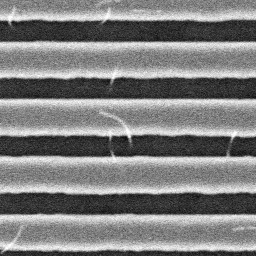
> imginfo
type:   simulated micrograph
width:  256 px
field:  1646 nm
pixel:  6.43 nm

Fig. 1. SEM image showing lines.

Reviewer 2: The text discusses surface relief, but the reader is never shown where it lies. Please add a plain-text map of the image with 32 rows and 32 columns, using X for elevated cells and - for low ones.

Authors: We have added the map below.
XXXXXXXXXXXXXXXXXXXXXXXXXXXXXXXX
XXXXXXXXXXXXXXXXXXXXXXXXXXXXXXXX
XXXX-XXXXXXX----XXXX----XXXX----
--------------------------------
--------------------------------
XXXXXXXXXXXXXXXXXXXXXXXXXXXXXXXX
XXXXXXXXXXXXXXXXXXXXXXXXXXXXXXXX
XXXXXXXXXXXXXXXXXXXXXXXXXXXXXXXX
XXXXXXXXXXXXXXXXXXXXXXXXXXXXXXXX
XXXXXXXXXXXXXXXXXXXXXXXXXXXXXXXX
--------------------------------
--------------------------------
---XX------------------X--------
XXXXXXXXXXXXXXXXXXXXXXXXXXXXXXXX
XXXXXXXXXXXXXXXXXXXXXXXXXXXXXXXX
XXXXXXXXXXXXXXXXXXXXXXXXXXXXXXXX
XXXXXXXXXXXXXXXXXXXXXXXXXXXXXXXX
--------------------------------
--------------------------------
--------------------------------
XXXXXXXXXXXXXXXXXXXXXXXXXXXXXXXX
XXXXXXXXXXXXXXXXXXXXXXXXXXXXXXXX
XXXXXXXXXXXXXXXXXXXXXXXXXXXXXXXX
XXXXXXXXXXXXXXXXXXXXXXXXXXXXXXXX
--------------------------------
--------------------------------
--------------------------------
XXXXXXXXXXXXXXXXXXXXXXXXXXXXXXXX
XXXXXXXXXXXXXXXXXXXXXXXXXXXXXXXX
XXXXXXXXXXXXXXXXXXXXXXXXXXXXXXXX
XXXXXXXXXXXXXXXXXXXXXXXXXXXXXXXX
--------------------------------